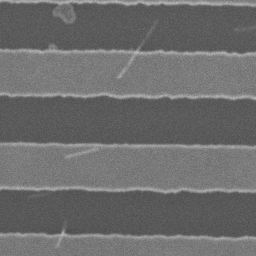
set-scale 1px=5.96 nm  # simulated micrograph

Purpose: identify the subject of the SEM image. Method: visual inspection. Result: lines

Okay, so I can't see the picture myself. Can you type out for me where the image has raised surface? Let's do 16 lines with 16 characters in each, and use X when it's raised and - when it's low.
----------------
----------------
----------------
XXXXXXXXXXXXXXXX
XXXXXXXXXXXXXXXX
XXXXXXXXXXXXXXXX
----------------
----------------
----------------
XXXXXXXXXXXXXXXX
XXXXXXXXXXXXXXXX
XXXXXXXXXXXXXXXX
----------------
----------------
----------------
XXXXXXXXXXXXXXXX